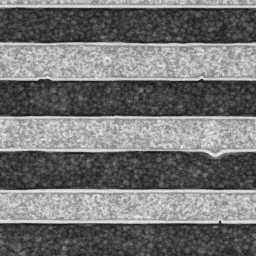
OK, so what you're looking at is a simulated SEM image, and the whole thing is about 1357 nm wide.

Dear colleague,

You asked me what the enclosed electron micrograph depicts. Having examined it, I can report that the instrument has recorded one or a few lines or trenches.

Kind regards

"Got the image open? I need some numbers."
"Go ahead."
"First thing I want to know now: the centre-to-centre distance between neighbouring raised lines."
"0.384 µm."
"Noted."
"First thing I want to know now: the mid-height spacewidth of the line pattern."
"200 nanometers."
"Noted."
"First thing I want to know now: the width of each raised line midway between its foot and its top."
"33.8 pixels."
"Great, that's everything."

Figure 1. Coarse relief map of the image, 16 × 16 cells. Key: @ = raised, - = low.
----------------
----------------
----------------
@@@@@@@@@@@@@@@@
@@@@@@@@@@@@@@@@
----------------
----------------
@@@@@@@@@@@@@@@@
@@@@@@@@@@@@@@@@
-------------@--
----------------
----------------
@@@@@@@@@@@@@@@@
@@@@@@@@@@@@@@@@
----------------
----------------